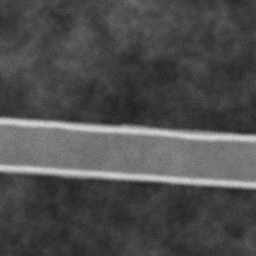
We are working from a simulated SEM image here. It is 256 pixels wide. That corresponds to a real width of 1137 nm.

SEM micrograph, one or a few lines or trenches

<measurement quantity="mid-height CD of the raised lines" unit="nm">202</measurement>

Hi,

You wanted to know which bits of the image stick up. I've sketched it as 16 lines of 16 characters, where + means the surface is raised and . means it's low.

................
................
................
................
................
................
................
................
++++++++++++....
++++++++++++++++
++++++++++++++++
...............+
................
................
................
................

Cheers